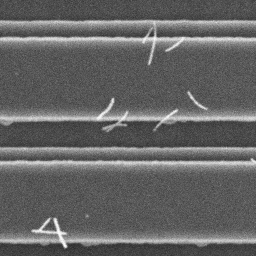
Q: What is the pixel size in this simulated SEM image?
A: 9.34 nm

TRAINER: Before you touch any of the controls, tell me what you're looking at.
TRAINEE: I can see lines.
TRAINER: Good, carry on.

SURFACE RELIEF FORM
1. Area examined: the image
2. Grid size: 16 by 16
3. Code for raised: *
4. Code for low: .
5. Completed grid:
................
................
****************
****************
****************
****************
****************
***.*..**.*.*...
................
................
****************
****************
****************
****************
****************
................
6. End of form